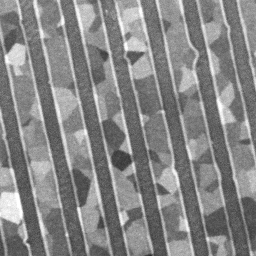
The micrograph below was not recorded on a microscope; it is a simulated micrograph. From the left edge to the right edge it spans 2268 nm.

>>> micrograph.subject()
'parallel lines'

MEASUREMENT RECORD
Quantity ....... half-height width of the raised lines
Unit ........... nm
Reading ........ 203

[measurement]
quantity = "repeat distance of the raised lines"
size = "354 nanometres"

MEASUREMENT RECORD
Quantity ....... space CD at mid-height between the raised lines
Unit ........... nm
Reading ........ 151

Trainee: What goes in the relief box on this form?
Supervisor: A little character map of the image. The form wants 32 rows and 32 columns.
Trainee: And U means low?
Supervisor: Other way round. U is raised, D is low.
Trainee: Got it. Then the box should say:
UUDDUUUDDUUUDDDUUDDDUUUDDUUUDDUU
UUDDDUUUDDUUUDDUUUDDUUUDDUUUDDUU
UUUDDUUUDDUUUDDUUUDDUUUDDUUUDDUU
UUUDDUUUDDUUUDDUUUDDUUUDDUUUUDUU
UUUDDUUUDDUUUDDUUUDDDUUDDDUUUDDU
UUUDDUUUDDDUUDDDUUUDDUUUDDUUUDDU
DUUDDDUUUDDUUUDDUUUDDUUUUDUUUDDU
DUUUDDUUUDDUUUDDUUUDDUUUDDUUUDDU
DUUUDDUUUDDUUUDDUUUDDUUUDDUUUDDD
DUUUDDUUUDDUUUDDUUUDDDUUDDDUUUDD
DUUUDDUUUDDDUUDDDUUUDDUUUDDUUUDD
DDUUUDDUUUDDUUUDDUUUDDUUUDDUUUDD
DDUUUDDUUUDDUUUDDUUUDDUUUDDUUUDD
DDUUUDDUUUDDUUUDDUUUDDUUUDDUUUUD
DDUUUDDUUUDDUUUDDDUUUDDUUUDDUUUD
DDUUUDDDUUDDDUUUDDUUUDDUUUDDUUUD
DDDUUUDDUUUDDUUUDDUUUDDUUUDDUUUD
UDDUUUDDUUUDDUUUDDUUUDDUUUDDUUUD
UDDUUUDDUUUDDUUUDDUUUDDUUUDDDUUU
UDDUUUDDUUUDDUUUDDDUUUDDUUUDDUUU
UDDUUUUDDUUUDDUUUDDUUUDDUUUDDUUU
UUDDUUUDDUUUDDUUUDDUUUDDUUUDDUUU
UUDDUUUDDUUUDDUUUDDUUUDDUUUDDUUU
UUDDUUUDDUUUDDUUUDDUUUDDDUUUDDUU
UUDDUUUDDUUUDDDUUUDDUUUDDUUUDDUU
UUDDDUUDDDUUUDDUUUDDUUUDDUUUDDUU
UUUDDUUUDDUUUDDUUUDDUUUDDUUUDDUU
UUUDDUUUDDUUUDDUUUDDUUUDDUUUDDDU
UUUDDUUUDDUUUDDUUUDDUUUDDDUUUDDU
UUUDDUUUDDDUUDDDUUUDDUUUDDUUUDDU
DUUDDDUUUDDUUUDDUUUDDUUUDDUUUDDU
DUUUDDUUUDDUUUDDUUUDDUUUDDUUUDDU